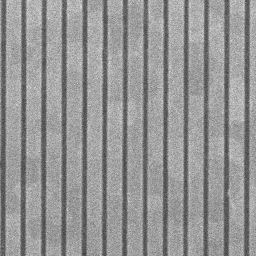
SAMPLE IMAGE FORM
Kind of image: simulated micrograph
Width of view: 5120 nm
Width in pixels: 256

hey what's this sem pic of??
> parallel lines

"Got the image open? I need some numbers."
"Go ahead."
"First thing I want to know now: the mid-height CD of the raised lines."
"283 nm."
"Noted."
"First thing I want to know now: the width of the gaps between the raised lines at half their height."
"122 nm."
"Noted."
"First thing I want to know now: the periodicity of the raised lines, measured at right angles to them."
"406 nanometers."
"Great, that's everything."